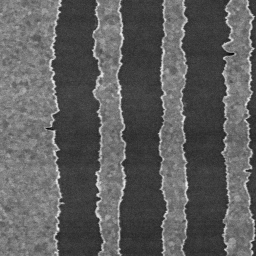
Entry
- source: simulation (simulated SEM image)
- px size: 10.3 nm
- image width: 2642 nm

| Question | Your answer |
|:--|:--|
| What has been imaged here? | one or a few lines or trenches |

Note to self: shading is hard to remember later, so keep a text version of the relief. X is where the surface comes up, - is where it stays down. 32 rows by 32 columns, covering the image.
XXXXXXX-----XXX-----XXX------XX-
XXXXXXX-----XXX-----XXX-----XXX-
XXXXXXX-----XXX------XX-----XXXX
XXXXXXX-----XXX-----XXX------XX-
XXXXXXX-----XXX------XX------XX-
XXXXXXX-----XXX-----XXX-----XXX-
XXXXXXX-----XXX-----XXX------XX-
XXXXXXX-----XXX-----XXX-----XXX-
XXXXXX------XXX-----XXX-----XXX-
XXXXXXX------XX-----XXX-----XXX-
XXXXXXX-----XXX-----XXX-----XXX-
XXXXXXX-----XXX-----XXX-----XXX-
XXXXXXX-----XXX-----XXX-----XXX-
XXXXXXX-----XXX-----XXX-----XXX-
XXXXXXX-----XXX-----XXX-----XXX-
XXXXXXX------XX-----XXX-----XXX-
XXXXXXX------XX-----XXX-----XXX-
XXXXXXX------XX-----XXX-----XXX-
XXXXXXX------XXX----XXX-----XXX-
XXXXXXX------XXX----XXX-----XXX-
XXXXXXX------XX-----XXX-----XXX-
XXXXXXX-----XXX-----XXX-----XXX-
XXXXXXX-----XXXX----XXX-----XXX-
XXXXXXX-----XXXX----XXX-----XXX-
XXXXXXXX----XXX------XX------XX-
XXXXXXX-----XXX------XX------XX-
XXXXXXX-----XXX------XX-----XXX-
XXXXXXX-----XXX------XX-----XXXX
XXXXXXX------XX-----XXX-----XXXX
XXXXXXX------XX-----XXX-----XXXX
XXXXXXX------XX-----XXX-----XXX-
XXXXXXX-----XXX-----XXX-----XXX-